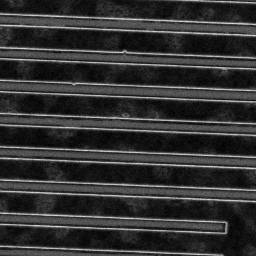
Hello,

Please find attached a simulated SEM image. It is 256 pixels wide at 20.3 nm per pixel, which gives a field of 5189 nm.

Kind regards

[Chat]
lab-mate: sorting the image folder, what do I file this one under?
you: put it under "parallel lines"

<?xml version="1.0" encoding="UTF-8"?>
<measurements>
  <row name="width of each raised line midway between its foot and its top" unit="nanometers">446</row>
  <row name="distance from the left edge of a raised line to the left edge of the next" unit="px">33.1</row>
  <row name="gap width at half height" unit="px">11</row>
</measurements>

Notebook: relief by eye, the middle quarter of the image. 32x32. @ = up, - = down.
@@@@@@@@@@@@@@@@@@@@@@@@@@@-----
@@@@@@@@@@@@@@@@@@@@@@@@@@@@@@@@
@@@@@@@@@@@@@@@@@@@@@@@@@@@@@@@@
@@@@@@@@@@@@@@@@@@@@@@@@@@@@@@@@
@@@@@@@@@@@@@@@@@@@@@@@@@@@@@@@@
---------------------@@@@@@@@@@@
--------------------------------
--------------------------------
@@@@@@@@@@@@@@@@@@@@@-----------
@@@@@@@@@@@@@@@@@@@@@@@@@@@@@@@@
@@@@@@@@@@@@@@@@@@@@@@@@@@@@@@@@
@@@@@@@@@@@@@@@@@@@@@@@@@@@@@@@@
@@@@@@@@@@@@@@@@@@@@@@@@@@@@@@@@
---------------@@@@@@@@@@@@@@@@@
--------------------------------
--------------------------------
@@@@@@@@@@@@@@@-----------------
@@@@@@@@@@@@@@@@@@@@@@@@@@@@@@@@
@@@@@@@@@@@@@@@@@@@@@@@@@@@@@@@@
@@@@@@@@@@@@@@@@@@@@@@@@@@@@@@@@
@@@@@@@@@@@@@@@@@@@@@@@@@@@@@@@@
---@@@@@@@@@@@@@@@@@@@@@@@@@@@@@
----------------------------@@@@
--------------------------------
@@@@----------------------------
@@@@@@@@@@@@@@@@@@@@@@@@@@@@@-@@
@@@@@@@@@@@@@@@@@@@@@@@@@@@@@@@@
@@@@@@@@@@@@@@@@@@@@@@@@@@@@@@@@
@@@@@@@@@@@@@@@@@@@@@@@@@@@@@@@@
@@@@@@@@@@@@@@@@@@@@@@@@@@@@@@@@
----------------------@@@@@@@@@@
--------------------------------